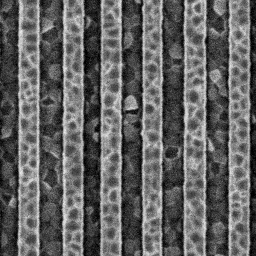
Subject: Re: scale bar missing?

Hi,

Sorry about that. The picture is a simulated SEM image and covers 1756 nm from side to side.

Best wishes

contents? parallel lines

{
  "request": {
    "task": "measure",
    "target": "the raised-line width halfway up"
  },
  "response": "128 nm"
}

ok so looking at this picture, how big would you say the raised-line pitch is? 289 nanometres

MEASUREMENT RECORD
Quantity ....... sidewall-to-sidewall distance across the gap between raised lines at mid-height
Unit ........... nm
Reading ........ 162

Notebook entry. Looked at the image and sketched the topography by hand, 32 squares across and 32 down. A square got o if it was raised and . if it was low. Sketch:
...oo...oo...oo...oo...ooo...oo.
...oo...oo...oo...oo...ooo...oo.
...oo...oo...oo...oo...ooo...oo.
...oo...oo...oo...oo...ooo...oo.
..ooo...oo...oo...oo...ooo...oo.
..ooo...oo...oo...oo...ooo...oo.
...oo...oo...oo...oo...ooo...oo.
..ooo...oo...oo...oo...ooo...oo.
..ooo...oo...oo...oo...ooo...oo.
..ooo...oo...oo...oo...ooo...oo.
..ooo...oo...oo...oo...ooo...oo.
..ooo...oo...oo...oo...ooo...oo.
...oo...oo...oo...oo...ooo...oo.
...oo...oo...oo...oo...ooo...oo.
...oo...oo...oo...oo...ooo...oo.
...oo...oo...oo...oo...ooo...oo.
...oo...oo...oo...oo...ooo...oo.
..ooo...oo...oo...oo...ooo...oo.
...oo...oo...oo...oo...ooo...oo.
...oo...oo...oo...oo...ooo...oo.
..ooo...oo...oo...oo...ooo...oo.
..ooo...oo...oo...oo...ooo...oo.
..ooo...oo...oo...oo...ooo...oo.
..ooo...oo...oo...oo...ooo...oo.
..ooo...oo...oo...oo...ooo...oo.
..ooo...oo...oo...oo...ooo...oo.
..ooo...oo...oo...oo...ooo...oo.
..ooo...oo...oo...oo...ooo...oo.
..ooo...oo...oo...oo...ooo...oo.
..ooo...oo...oo...oo...ooo...oo.
..ooo...oo...oo...oo...ooo...oo.
..ooo...oo...oo...oo...ooo...oo.